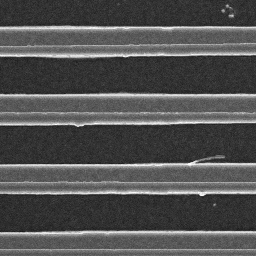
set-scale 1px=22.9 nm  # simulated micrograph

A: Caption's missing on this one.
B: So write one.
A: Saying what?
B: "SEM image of lines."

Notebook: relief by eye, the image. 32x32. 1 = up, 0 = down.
00000000000000000000000000000000
00000000000000000000000000000000
00000000000000000000000000000000
00000010101101111111111111111111
11111111111111111111111111111111
11111111111111111111111111111111
11111111111111111111111111111111
00000000000000000000000000000000
00000000000000000000000000000000
00000000000000000000000000000000
00000000000000000000000000000000
00000000000000000000000000000000
11111111111111111111111111111111
11111111111111111111111111111111
11111111111111111111111111111111
00000010011000000000000000000000
00000000000000000000000000000000
00000000000000000000000000000000
00000000000000000000000000000000
00000000000000000000000000000000
00000000000000000000000110000000
11111111111111111111111111111111
11111111111111111111111111111111
11111111111111111111111111111111
00000000000000000000000000000000
00000000000000000000000000000000
00000000000000000000000000000000
00000000000000000000000000000000
00000000000000000000000000000000
11111111111111111111111111111111
11111111111111111111111111111111
11111111111111111111111111111111